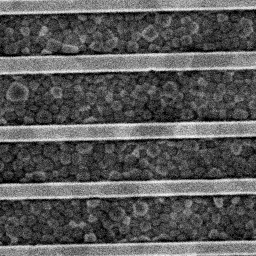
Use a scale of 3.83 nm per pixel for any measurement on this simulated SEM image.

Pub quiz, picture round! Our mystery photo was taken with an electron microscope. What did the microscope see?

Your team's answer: one or a few lines or trenches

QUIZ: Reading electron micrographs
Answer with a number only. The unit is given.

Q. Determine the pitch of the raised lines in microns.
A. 0.241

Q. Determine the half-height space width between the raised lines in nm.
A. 170